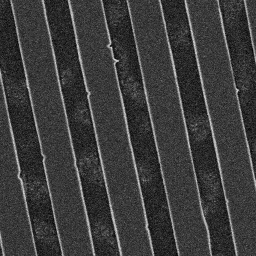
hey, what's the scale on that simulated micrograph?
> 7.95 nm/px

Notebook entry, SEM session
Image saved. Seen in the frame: parallel lines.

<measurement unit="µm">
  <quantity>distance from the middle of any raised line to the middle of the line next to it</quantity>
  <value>0.454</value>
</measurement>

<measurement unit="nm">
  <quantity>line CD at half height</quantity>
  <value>258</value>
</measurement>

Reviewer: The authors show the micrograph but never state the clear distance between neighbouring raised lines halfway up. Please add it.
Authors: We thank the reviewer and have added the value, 0.196 um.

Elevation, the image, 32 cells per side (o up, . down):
.oooo....oooo...oooo...oooo....o
..oooo...oooo...oooo...ooooo...o
..oooo...oooo...ooooo...oooo...o
..oooo...oooo....oooo...oooo...o
..oooo...ooooo...oooo...oooo...o
..oooo....oooo...oooo...oooo....
...oooo...oooo...oooo...ooooo...
...oooo...oooo...ooooo...oooo...
...oooo...oooo....oooo...oooo...
...oooo...ooooo...oooo...oooo...
...ooooo...oooo...oooo...oooo...
o...oooo...oooo...oooo...ooooo..
o...oooo...oooo...ooooo...oooo..
o...oooo...ooooo...oooo...oooo..
o...oooo...ooooo...oooo...oooo..
o...ooooo...oooo...oooo...oooo..
o....oooo...oooo...oooo....oooo.
oo...oooo...oooo...ooooo...oooo.
oo...oooo...oooo....oooo...oooo.
oo...oooo...ooooo...oooo...oooo.
oo....ooo....oooo...oooo...ooooo
oo....oooo...oooo...oooo....oooo
ooo...oooo...oooo...ooooo...oooo
ooo...oooo...ooooo...oooo...oooo
ooo...oooo...ooooo...oooo...oooo
ooo....oooo...oooo...oooo...oooo
ooo....oooo...oooo...oooo....ooo
oooo...oooo...oooo...ooooo...ooo
oooo...oooo...ooooo...oooo...ooo
oooo...oooo....oooo...oooo...ooo
oooo....oooo...oooo...oooo...ooo
ooooo...oooo...oooo...oooo...ooo